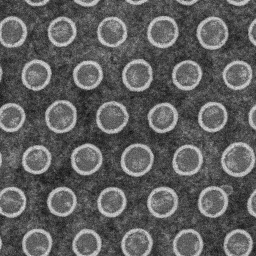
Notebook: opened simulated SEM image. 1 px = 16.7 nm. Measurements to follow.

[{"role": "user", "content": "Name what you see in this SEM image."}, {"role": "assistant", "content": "a regular array of raised bodies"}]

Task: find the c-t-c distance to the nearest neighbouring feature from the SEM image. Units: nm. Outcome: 816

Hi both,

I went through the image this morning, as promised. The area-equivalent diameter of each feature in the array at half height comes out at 0.458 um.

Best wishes